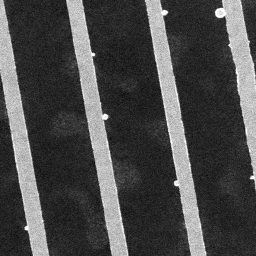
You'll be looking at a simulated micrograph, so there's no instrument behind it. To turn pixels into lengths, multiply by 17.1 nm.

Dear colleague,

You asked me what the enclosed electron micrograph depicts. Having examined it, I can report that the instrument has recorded one or a few lines or trenches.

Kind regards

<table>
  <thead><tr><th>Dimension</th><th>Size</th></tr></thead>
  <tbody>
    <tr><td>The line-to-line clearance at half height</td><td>62.3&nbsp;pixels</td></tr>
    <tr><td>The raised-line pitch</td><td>1.33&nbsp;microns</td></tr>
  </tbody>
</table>